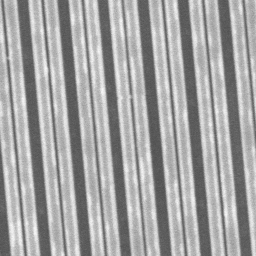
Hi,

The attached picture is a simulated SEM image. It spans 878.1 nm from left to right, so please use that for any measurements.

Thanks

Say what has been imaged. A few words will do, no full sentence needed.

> parallel lines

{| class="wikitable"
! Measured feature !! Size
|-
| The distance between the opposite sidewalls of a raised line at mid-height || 0.041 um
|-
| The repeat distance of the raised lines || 68.8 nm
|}